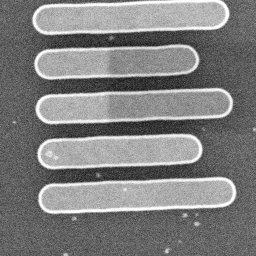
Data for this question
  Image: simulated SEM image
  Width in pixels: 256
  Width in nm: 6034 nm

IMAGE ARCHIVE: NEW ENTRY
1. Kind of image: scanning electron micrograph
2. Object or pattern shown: groups of lines, slits or small figures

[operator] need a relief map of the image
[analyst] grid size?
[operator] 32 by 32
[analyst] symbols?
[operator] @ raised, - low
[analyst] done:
---------------@@@@@@@@@@@@@----
-----@@@@@@@@@@@@@@@@@@@@@@@----
----@@@@@@@@@@@@@@@@@@@@@@@@----
-----@@@@@@@@@@@@@@@@@@@--------
--------------------------------
--------------------------------
------@@@@@@@@@@@@@@@@@@--------
-----@@@@@@@@@@@@@@@@@@@@-------
-----@@@@@@@@@@@@@@@@@@@--------
-----@@@@@@@@-------------------
--------------------------------
--------------------@@@@@@@@----
-----@@@@@@@@@@@@@@@@@@@@@@@@---
-----@@@@@@@@@@@@@@@@@@@@@@@@---
-----@@@@@@@@@@@@@@@@@@@@@@@----
--------------------------------
--------------------------------
----------@@@@@@@@@@@@@@@-------
-----@@@@@@@@@@@@@@@@@@@@-------
-----@@@@@@@@@@@@@@@@@@@@-------
-----@@@@@@@@@@@@@--------------
--------------------------------
-----------------------@@@@@----
------@@@@@@@@@@@@@@@@@@@@@@@---
-----@@@@@@@@@@@@@@@@@@@@@@@@---
-----@@@@@@@@@@@@@@@@@@@@@@@----
--------------------------------
--------------------------------
--------------------------------
--------------------------------
--------------------------------
--------------------------------